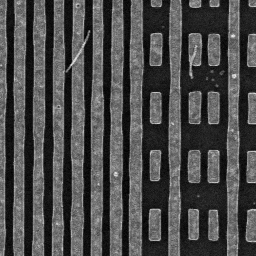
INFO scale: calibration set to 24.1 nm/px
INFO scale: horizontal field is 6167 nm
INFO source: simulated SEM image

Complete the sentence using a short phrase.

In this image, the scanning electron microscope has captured wiring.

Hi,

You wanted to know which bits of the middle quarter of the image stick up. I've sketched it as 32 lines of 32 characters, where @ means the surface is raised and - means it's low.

--@@@--@@@--@@@--@@@-------@@---
--@@@--@@@--@@---@@@-------@@---
--@@@--@@@--@@---@@@-------@@---
--@@@--@@@--@@---@@--------@@---
--@@@--@@@--@@---@@--------@@---
--@@@--@@@--@@---@@--------@@---
--@@@--@@@--@@---@@--------@@---
--@@@--@@@--@@---@@---@@---@@--@
--@@@--@@@--@@---@@---@@---@@--@
--@@@--@@@--@@---@@---@@---@@--@
--@@@--@@@--@@---@@---@@--@@@--@
--@@@--@@@--@@---@@---@@--@@@--@
--@@@--@@@--@@---@@---@@--@@@--@
--@@@--@@@--@@---@@---@@--@@@--@
--@@@--@@@--@@---@@---@@--@@@--@
--@@@--@@@--@@---@@-------@@@---
--@@@--@@@--@@---@@-------@@@---
--@@@--@@@--@@---@@-------@@@---
--@@@--@@@--@@---@@-------@@@---
--@@@--@@@--@@---@@-------@@@---
--@@@--@@@--@@---@@-------@@@---
--@@@--@@@--@@---@@-------@@@---
--@@@--@@@--@@---@@---@@--@@@--@
--@@@--@@@--@@--@@@---@@--@@@--@
--@@@--@@@--@@--@@@---@@--@@@--@
--@@@--@@@--@@--@@@---@@---@@--@
--@@@--@@@--@@--@@@---@@---@@--@
--@@@--@@@--@@--@@@---@@---@@--@
--@@@--@@@--@@---@@---@@---@@--@
--@@@--@@@--@@---@@--------@@---
--@@@--@@@--@@---@@--------@@---
--@@@--@@@--@@---@@--------@@---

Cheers